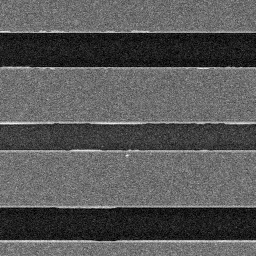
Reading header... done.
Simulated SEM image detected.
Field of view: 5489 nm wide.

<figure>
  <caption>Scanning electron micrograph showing lines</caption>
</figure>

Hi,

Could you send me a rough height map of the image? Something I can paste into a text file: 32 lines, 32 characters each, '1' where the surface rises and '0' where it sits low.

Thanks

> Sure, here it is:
11111111111111111111111111111111
11111111111111111111111111111111
11111111111111111111111111111111
11111111111111111111111111111111
00000000000000000000000000000000
00000000000000000000000000000000
00000000000000000000000000000000
00000000000000000000000000000000
00000000000000000000000000000000
11111111111111111111111111111111
11111111111111111111111111111111
11111111111111111111111111111111
11111111111111111111111111111111
11111111111111111111111111111111
11111111111111111111111111111111
00000000000000000000000000000000
00000000000000000000000000000000
00000000000000000000000000000000
00000000000000000000000000000000
11111111111111111111111111111111
11111111111111111111111111111111
11111111111111111111111111111111
11111111111111111111111111111111
11111111111111111111111111111111
11111111111111111111111111111111
11111111111111111111111111111111
00000000000000000000000000000000
00000000000000000000000000000000
00000000000000000000000000000000
00000000000000000000000000000000
11111111111111111111111111111111
11111111111111111111111111111111